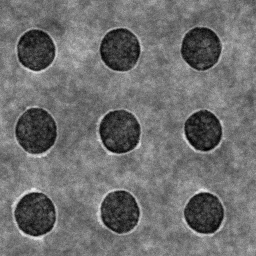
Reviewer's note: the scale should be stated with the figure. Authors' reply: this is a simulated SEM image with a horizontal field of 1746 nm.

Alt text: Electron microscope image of a regular array of holes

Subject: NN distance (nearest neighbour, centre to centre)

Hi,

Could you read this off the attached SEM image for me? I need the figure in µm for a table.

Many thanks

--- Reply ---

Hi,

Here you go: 0.555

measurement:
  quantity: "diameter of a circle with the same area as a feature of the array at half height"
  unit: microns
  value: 0.294